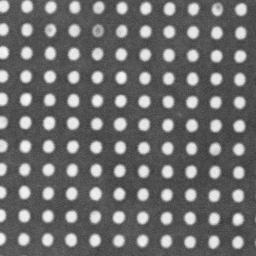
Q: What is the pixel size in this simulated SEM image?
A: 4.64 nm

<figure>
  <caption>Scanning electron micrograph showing a regular array of raised bodies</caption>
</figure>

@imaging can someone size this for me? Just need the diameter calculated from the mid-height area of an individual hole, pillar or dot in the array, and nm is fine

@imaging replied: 52.4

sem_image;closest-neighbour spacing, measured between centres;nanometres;107